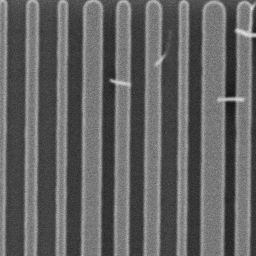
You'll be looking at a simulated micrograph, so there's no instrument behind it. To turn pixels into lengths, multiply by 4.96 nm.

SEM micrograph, groups of lines, slits or small figures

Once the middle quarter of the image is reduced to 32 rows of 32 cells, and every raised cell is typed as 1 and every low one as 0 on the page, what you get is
10000111100001111000011100000110
10000111100001111000011100000110
10000111100001111000011100000110
10000111100001110000011100000110
10000111100011110000011100000110
10000111100001111000011100000110
10000111100001110000011100000110
10000111100001111000111100000110
10000111100001111000111100000110
10000111100001111000111100000110
10000111100001110000111100000110
10000111100001110000011100000110
10000111100001110000111100000110
10000111100001110000111100000110
10000111100001110000111100000110
10000111100001110000111100000110
10000111100001110000111100000110
10000111100001110000111100000110
10000111100001110000111100000110
10000111100001110000111100000110
10000111100001110000111100000110
10000111100001110000111100000110
10000111100001110000111100000110
10000111100001110000111100000110
10000111100001110000111100000110
10000111100001110000111100000110
10000111100001110000111100000110
00000111100001110000111100000110
00000111100001110000111100000110
00000111100001110000111100000110
10000111100001110000111100000110
10000111100001110000111100000110